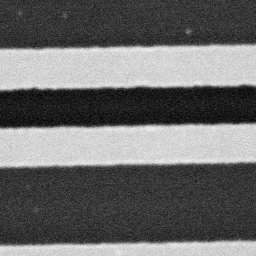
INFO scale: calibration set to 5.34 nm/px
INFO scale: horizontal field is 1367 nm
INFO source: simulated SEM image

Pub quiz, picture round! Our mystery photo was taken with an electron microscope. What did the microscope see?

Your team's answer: lines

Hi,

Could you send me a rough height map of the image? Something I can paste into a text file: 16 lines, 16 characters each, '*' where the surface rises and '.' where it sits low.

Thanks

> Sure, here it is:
................
................
................
****************
****************
****............
................
................
****************
****************
................
................
................
................
................
****************